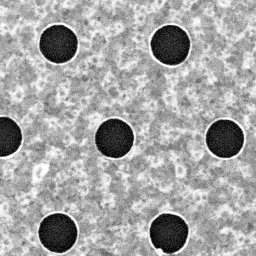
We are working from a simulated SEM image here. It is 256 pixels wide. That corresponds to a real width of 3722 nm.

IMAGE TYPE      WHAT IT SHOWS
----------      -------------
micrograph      holes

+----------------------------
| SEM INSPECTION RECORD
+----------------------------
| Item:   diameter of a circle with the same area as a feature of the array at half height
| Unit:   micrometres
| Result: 0.591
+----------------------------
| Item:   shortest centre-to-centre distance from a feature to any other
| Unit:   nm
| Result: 1580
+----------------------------